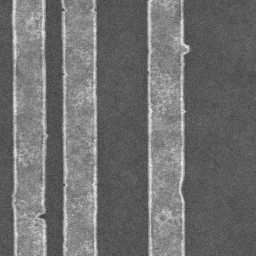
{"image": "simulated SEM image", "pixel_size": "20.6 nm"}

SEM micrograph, one or a few lines or trenches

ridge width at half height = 0.622 microns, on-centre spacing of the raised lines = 68.4 px